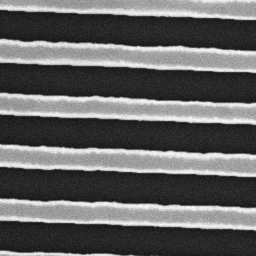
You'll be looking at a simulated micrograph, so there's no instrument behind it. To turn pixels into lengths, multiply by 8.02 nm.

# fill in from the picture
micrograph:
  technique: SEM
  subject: lines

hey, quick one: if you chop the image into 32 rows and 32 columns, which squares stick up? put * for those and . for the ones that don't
********************************
.......*************************
................................
................................
................................
**********.*....................
*******************************.
********************************
..................**************
................................
................................
................................
*******************.............
********************************
......**************************
...............................*
................................
................................
******..........................
********************************
********************************
.................***************
................................
................................
................................
***************.................
********************************
********************************
.........................*******
................................
................................
*...............................